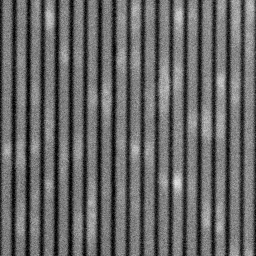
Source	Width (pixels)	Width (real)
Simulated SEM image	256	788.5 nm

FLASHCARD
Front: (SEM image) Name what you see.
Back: parallel lines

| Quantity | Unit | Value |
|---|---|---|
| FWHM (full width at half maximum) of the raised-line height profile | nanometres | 33.5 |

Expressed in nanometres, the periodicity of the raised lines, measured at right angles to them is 43.9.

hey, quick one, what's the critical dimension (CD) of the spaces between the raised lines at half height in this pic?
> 0.0104 µm